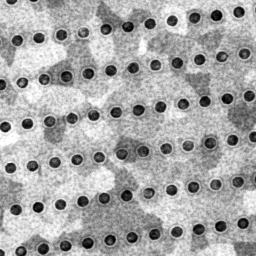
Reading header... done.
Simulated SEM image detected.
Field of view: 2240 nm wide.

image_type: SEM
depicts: a regular array of holes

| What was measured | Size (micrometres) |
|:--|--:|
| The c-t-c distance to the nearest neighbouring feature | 0.195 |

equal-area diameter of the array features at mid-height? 109 nanometres